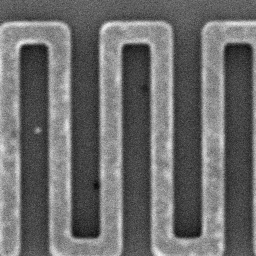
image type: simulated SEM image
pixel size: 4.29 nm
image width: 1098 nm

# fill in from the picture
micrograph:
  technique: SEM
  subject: groups of lines, slits or small figures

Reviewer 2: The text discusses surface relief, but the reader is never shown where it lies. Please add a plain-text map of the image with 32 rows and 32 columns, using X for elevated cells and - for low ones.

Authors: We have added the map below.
--------------------------------
--------------------------------
--------------------------------
XXXXXXXX-----XXXXXXXX-----XXXXXX
XXXXXXXXX----XXXXXXXX----XXXXXXX
XXX---XXX----XXX--XXX----XXX---X
XX----XXX----XX----XX----XXX----
XX----XXX----XX----XX----XXX----
XX----XXX----XX----XX----XXX----
XX----XXX----XX----XX----XXX----
XX----XXX----XX----XX----XXX----
XX----XXX----XX----XX----XXX----
XX----XXX----XX----XX----XXX----
XX----XXX----XX----XX----XXX----
XX----XXX----XX----XX----XXX----
XX----XXX----XX----XX----XXX----
XX----XXX----XX----XX----XXX----
XX----XXX----XX----XX----XXX----
XX----XXX----XX----XX----XXX----
XX----XXX----XX----XX----XXX----
XX----XXX----XX----XX----XXX----
XX----XXX----XX----XX----XXX----
XX----XXX----XX----XX----XXX----
XX----XXX----XX----XX----XXX----
XX----XXX----XX----XX----XXX----
XX----XXX----XX----XX----XXX----
XX----XXX----XX----XX----XXX----
XX----XXX----XX----XXX---XXX----
XX----XXX----XX----XXX---XXX----
XX----XXX---XXX----XXX---XXX----
XX----XXXXXXXXX----XXXXXXXXX----
XX----XXXXXXXXX----XXXXXXXXX----